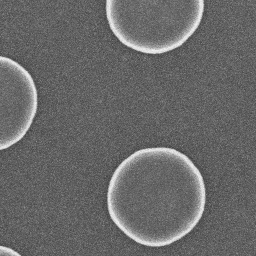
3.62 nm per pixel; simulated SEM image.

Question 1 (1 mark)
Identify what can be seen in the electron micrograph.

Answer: raised bodies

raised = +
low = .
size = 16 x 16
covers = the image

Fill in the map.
.......++++++...
.......+++++....
........+++.....
................
++..............
++..............
++..............
++..............
+...............
.........++.....
.......+++++....
.......++++++...
.......++++++...
.......+++++....
........++++....
................